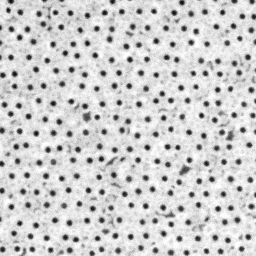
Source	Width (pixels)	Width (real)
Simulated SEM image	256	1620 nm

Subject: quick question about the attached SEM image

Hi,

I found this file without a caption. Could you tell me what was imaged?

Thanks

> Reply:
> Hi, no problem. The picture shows a regular array of holes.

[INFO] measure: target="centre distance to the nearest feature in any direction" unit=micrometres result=0.0737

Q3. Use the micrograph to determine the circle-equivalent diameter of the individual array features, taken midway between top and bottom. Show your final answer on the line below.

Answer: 42.9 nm